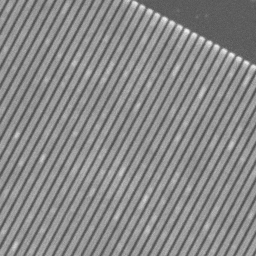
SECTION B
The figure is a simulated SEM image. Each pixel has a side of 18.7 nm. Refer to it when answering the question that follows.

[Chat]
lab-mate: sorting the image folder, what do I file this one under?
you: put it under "parallel lines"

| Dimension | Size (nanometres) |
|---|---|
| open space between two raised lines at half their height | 72.2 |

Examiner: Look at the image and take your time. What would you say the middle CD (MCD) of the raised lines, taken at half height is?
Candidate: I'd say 92.8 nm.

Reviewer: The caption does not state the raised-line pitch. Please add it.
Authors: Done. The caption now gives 157 nanometres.